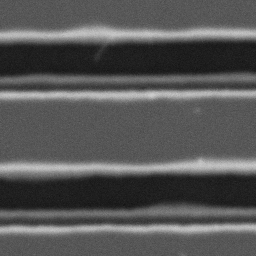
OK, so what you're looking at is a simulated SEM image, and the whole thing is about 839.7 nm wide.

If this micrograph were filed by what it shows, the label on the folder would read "lines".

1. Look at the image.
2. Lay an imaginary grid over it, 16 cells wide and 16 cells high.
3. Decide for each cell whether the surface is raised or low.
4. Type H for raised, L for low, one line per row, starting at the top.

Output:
HHHHHHHHHHHHHHHH
HHHHHHHHHHHHHHHH
LLLLLLLLLLLLLLLL
LLLLLLLLLLLLLLLL
LLLLLLLLLLLLLLLL
LLLLLLLLLLLLLLLL
HHHHHHHHHHHHHHHH
HHHHHHHHHHHHHHHH
HHHHHHHHHHHHHHHH
HHHHHHHHHHHHHHHH
HHHHHHHHHHHHHHHH
LLLLLLLLLLLLLLLL
LLLLLLLLLLLLLLLL
LLLLLLLLLLLLLLLL
HHHHHHHHHHHHHHHH
HHHHHHHHHHHHHHHH